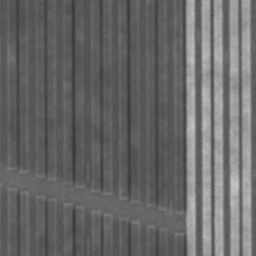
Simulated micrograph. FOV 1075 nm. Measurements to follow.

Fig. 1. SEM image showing parallel lines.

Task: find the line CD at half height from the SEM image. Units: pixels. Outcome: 8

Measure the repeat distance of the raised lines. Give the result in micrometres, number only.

0.0578